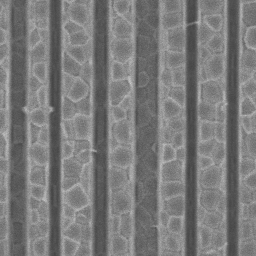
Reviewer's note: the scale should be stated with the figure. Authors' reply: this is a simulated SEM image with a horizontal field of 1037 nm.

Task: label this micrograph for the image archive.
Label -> parallel lines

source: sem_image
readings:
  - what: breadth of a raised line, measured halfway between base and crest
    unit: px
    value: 26.6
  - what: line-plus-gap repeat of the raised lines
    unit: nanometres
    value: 175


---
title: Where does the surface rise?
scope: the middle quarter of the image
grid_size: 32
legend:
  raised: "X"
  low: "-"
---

XXXXXXX----XXXXXX-------XXXXXX--
XXXXXXX----XXXXXX-------XXXXXX--
XXXXXXX----XXXXXX-------XXXXXX--
XXXXXXX----XXXXXX-------XXXXXX--
XXXXXXX----XXXXXX-------XXXXXX--
XXXXXXX----XXXXXX-------XXXXXX--
XXXXXXX----XXXXXX-------XXXXXX--
XXXXXXX----XXXXXX-------XXXXXXX-
XXXXXXX----XXXXXX-------XXXXXXX-
XXXXXXX----XXXXXX-------XXXXXXX-
XXXXXXX----XXXXXX-------XXXXXXX-
XXXXXXX----XXXXXX-------XXXXXXX-
XXXXXXX----XXXXXX-------XXXXXXX-
XXXXXXX----XXXXXX-------XXXXXXX-
XXXXXXX----XXXXXX-------XXXXXXX-
XXXXXXX----XXXXXX-------XXXXXXX-
XXXXXXX----XXXXXX-------XXXXXXX-
XXXXXXX----XXXXXX-------XXXXXXX-
XXXXXXX----XXXXXX-------XXXXXXX-
XXXXXXX----XXXXXX-------XXXXXXX-
XXXXXXX----XXXXXX-------XXXXXXX-
XXXXXXXX---XXXXXX-------XXXXXXX-
XXXXXXX----XXXXXX-------XXXXXXX-
XXXXXXX----XXXXXX-------XXXXXXX-
XXXXXXX----XXXXXX-------XXXXXXX-
XXXXXXX----XXXXXX-------XXXXXX--
XXXXXXX----XXXXXX-------XXXXXX--
XXXXXXX----XXXXXX-------XXXXXX--
XXXXXXX----XXXXXX-------XXXXXX--
XXXXXXX----XXXXXX-------XXXXXX--
XXXXXXX----XXXXXX-------XXXXXX--
XXXXXXX----XXXXXX-------XXXXXX--